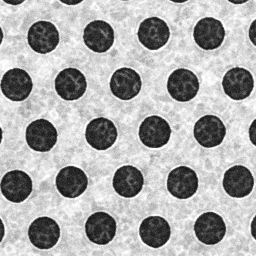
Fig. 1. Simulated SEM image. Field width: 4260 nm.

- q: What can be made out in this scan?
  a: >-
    a regular array of holes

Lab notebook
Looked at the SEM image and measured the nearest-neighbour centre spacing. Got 904 nm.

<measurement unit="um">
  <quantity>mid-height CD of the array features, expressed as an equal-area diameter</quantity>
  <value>0.551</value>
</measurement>